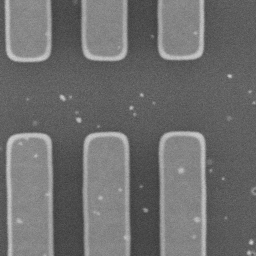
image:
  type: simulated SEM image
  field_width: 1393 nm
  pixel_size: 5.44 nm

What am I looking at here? groups of lines, slits or small figures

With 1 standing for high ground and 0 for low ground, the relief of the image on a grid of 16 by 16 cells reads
1110011100111000
1110011100111000
1110011100111000
0110001000110000
0000000000000000
0000000000000000
0000000000000000
0000000000000000
0110001000010000
0110011100111000
0110011100111000
0110011100111000
0110011100111000
0110011100111000
0110011100111000
0110011100111000